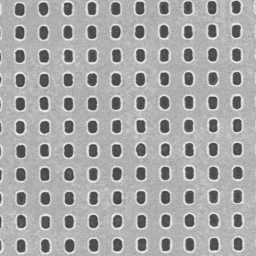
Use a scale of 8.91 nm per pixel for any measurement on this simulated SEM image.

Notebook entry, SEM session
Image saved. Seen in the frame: a regular array of holes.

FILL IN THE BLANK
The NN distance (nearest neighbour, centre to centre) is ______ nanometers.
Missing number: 210